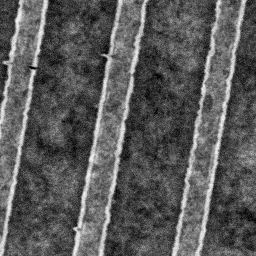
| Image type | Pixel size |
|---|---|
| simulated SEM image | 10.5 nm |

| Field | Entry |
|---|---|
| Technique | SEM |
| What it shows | one or a few lines or trenches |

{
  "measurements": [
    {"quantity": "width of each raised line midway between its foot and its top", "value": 252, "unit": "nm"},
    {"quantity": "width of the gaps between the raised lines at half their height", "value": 767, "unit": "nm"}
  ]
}